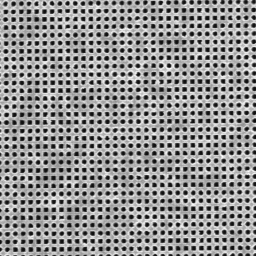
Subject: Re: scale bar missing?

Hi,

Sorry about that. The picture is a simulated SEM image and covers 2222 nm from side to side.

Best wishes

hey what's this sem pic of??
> a regular array of holes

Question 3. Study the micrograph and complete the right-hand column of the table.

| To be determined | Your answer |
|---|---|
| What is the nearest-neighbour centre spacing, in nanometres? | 64.4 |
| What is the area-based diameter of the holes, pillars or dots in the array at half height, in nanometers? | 46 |